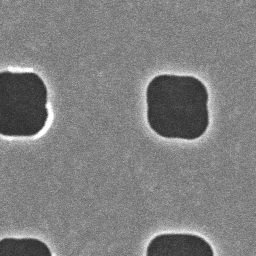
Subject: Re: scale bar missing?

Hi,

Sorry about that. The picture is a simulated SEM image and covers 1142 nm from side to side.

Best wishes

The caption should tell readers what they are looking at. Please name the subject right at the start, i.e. holes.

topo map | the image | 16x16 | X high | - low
XXXXXXXXXXXXXXXX
XXXXXXXXXXXXXXXX
XXXXXXXXXXXXXXXX
XXXXXXXXXXXXXXXX
-XXXXXXXXXXXXXXX
---XXXXXX----XXX
---XXXXXX----XXX
---XXXXXX----XXX
--XXXXXXXX--XXXX
XXXXXXXXXXXXXXXX
XXXXXXXXXXXXXXXX
XXXXXXXXXXXXXXXX
XXXXXXXXXXXXXXXX
XXXXXXXXXXXXXXXX
XXXXXXXXXXXXXXXX
---XXXXXX----XXX